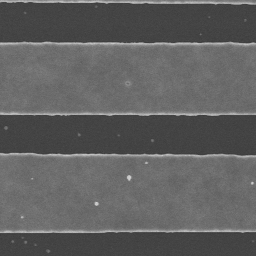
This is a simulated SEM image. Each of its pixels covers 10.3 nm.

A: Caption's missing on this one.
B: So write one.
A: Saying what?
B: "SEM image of lines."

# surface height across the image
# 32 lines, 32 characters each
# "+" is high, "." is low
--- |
..........................++++++
................................
................................
................................
................................
++++++++++++++++++++++++++++++++
++++++++++++++++++++++++++++++++
++++++++++++++++++++++++++++++++
++++++++++++++++++++++++++++++++
++++++++++++++++++++++++++++++++
++++++++++++++++++++++++++++++++
++++++++++++++++++++++++++++++++
++++++++++++++++++++++++++++++++
++++++++++++++++++++++++++++++++
................................
................................
................................
................................
................................
++++++++++++++++++++++++++++++++
++++++++++++++++++++++++++++++++
++++++++++++++++++++++++++++++++
++++++++++++++++++++++++++++++++
++++++++++++++++++++++++++++++++
++++++++++++++++++++++++++++++++
++++++++++++++++++++++++++++++++
++++++++++++++++++++++++++++++++
++++++++++++++++++++++++++++++++
++++++++++++++++++++++++++++++++
................................
................................
................................